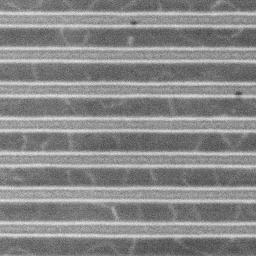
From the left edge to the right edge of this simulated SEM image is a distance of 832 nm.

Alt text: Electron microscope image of parallel lines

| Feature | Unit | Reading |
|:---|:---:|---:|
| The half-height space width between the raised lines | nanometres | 38.6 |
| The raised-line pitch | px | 35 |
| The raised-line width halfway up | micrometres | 0.0768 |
